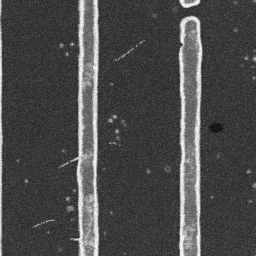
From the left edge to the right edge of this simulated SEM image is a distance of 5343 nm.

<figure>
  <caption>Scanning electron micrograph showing one or a few lines or trenches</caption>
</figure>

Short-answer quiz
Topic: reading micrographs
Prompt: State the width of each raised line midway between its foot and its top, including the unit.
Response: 0.326 µm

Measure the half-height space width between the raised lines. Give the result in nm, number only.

1820